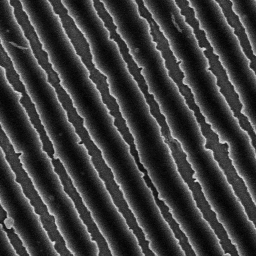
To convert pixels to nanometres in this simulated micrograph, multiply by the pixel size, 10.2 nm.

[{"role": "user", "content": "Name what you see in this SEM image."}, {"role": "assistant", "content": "parallel lines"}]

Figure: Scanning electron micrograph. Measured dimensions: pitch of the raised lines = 375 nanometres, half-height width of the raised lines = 0.272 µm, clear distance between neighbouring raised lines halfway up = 108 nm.